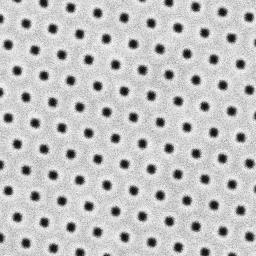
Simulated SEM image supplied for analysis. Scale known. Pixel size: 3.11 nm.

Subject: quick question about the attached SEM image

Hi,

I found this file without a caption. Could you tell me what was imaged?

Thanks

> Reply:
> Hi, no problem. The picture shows a regular array of holes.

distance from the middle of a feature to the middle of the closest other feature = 84.5 nm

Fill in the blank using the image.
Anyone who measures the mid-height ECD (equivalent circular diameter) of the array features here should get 32.8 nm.